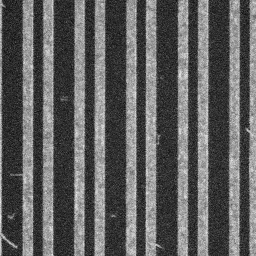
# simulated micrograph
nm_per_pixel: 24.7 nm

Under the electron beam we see parallel lines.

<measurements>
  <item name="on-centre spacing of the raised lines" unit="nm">639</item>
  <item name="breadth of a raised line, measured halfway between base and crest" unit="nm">225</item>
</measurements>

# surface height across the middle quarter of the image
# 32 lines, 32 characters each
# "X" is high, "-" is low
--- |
---XX---XX------XX---XX------XX-
---XX---XX------XX---XX------XX-
---XX---XX------XX---XX------XX-
---XX---XX------XX---XX------XX-
---XX---XX------XX---XX------XX-
---XX---XX------XX---XX------XX-
---XX---XX------XX---XX------XX-
---XX---XX------XX---XX------XX-
---XX---XX------XX---XX------XX-
---XX---XX------XX---XX------XX-
---XX---XX------XX---XX------XX-
---XX---XX------XX---XX------XX-
---XX---XX------XX---XX------XX-
---XX---XX------XX---XX------XX-
---XX---XX------XX---XX------XX-
---XX---XX------XX---XX------XX-
---XX---XX------XX---XX------XX-
---XX---XX------XX---XX------XX-
---XX---XX------XX---XX------XX-
---XX---XX------XX---XX------XX-
---XX---XX------XX---XX------XX-
---XX---XX------XX---XX------XX-
---XX---XX------XX---XX------XX-
---XX---XX------XX---XX------XX-
---XX---XX------XX---XX------XX-
---XX---XX------XX---XX------XX-
---XX---XX------XX---XX------XX-
---XX---XX------XX---XX------XX-
---XX---XX------XX---XX------XX-
---XX---XX------XX---XX------XX-
---XX----X------XX---XX------XX-
----X----X------XX---XX------XX-